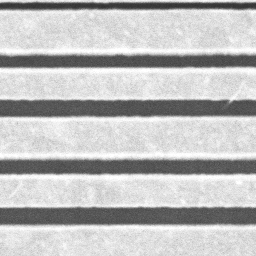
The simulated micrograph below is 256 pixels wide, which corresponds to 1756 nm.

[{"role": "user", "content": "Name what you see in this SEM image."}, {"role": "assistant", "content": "lines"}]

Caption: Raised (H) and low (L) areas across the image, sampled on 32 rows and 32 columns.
LLLLLLLLLLLLLLLLLLLLLLLLLLLLLLLL
HHHHHHHHHHHHHHHHHHHHHHHHHHHHHHHH
HHHHHHHHHHHHHHHHHHHHHHHHHHHHHHHH
HHHHHHHHHHHHHHHHHHHHHHHHHHHHHHHH
HHHHHHHHHHHHHHHHHHHHHHHHHHHHHHHH
HHHHHHHHHHHHHHHHHHHHHHHHHHHHHHHH
HHHHHHHHHHHHHHHHHHHHHHHHHHHHHHHH
LLLLLLLLLLLLLLLLLLLLLLLLLLLLLLLL
LLLLLLLLLLLLLLLLLLLLLLLLLLLLLLLL
HHHHHHHHHHHHHHHHHHHHHHHHHHHHHHHH
HHHHHHHHHHHHHHHHHHHHHHHHHHHHHHHH
HHHHHHHHHHHHHHHHHHHHHHHHHHHHHHHH
LLLLLLLLLLLLLLLLLLLLLLLLLLLLLLLL
LLLLLLLLLLLLLLLLLLLLLLLLLLLLLLLL
LLLLLLLLLLLLLLLLLLLLLLLLLLLLLLLL
HHHHHHHHHHHHHHHHHHHHHHHHHHHHHHHH
HHHHHHHHHHHHHHHHHHHHHHHHHHHHHHHH
HHHHHHHHHHHHHHHHHHHHHHHHHHHHHHHH
HHHHHHHHHHHHHHHHHHHHHHHHHHHHHHHH
HHHHHHHHHHHHHHHHHHHHHHHHHHHHHHHH
LLLLLLLLLLLLLLLLLLLLLLLLLLLLLLLL
LLLLLLLLLLLLLLLLLLLLLLLLLLLLLLLL
HHHHHHHHHHHHHHHHHHHHHHHHHHHHHHHH
HHHHHHHHHHHHHHHHHHHHHHHHHHHHHHHH
HHHHHHHHHHHHHHHHHHHHHHHHHHHHHHHH
HHHHHHHHHHHHHHHHHHHHHHHHHHHHHHHH
LLLLLLLLLLLLLLLLLLLLLLLLLLLLLLLL
LLLLLLLLLLLLLLLLLLLLLLLLLLLLLLLL
HHHHHHHHHHHHHHHHHHHHHHHHHHHHHHHH
HHHHHHHHHHHHHHHHHHHHHHHHHHHHHHHH
HHHHHHHHHHHHHHHHHHHHHHHHHHHHHHHH
HHHHHHHHHHHHHHHHHHHHHHHHHHHHHHHH